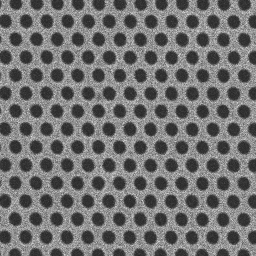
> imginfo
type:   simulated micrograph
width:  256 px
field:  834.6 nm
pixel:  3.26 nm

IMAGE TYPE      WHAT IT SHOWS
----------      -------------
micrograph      a regular array of holes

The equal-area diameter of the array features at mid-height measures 41.5 nm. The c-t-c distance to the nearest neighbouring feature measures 0.0668 micrometres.